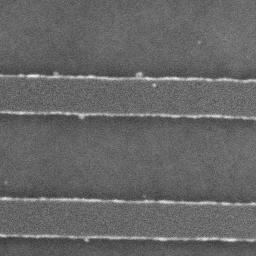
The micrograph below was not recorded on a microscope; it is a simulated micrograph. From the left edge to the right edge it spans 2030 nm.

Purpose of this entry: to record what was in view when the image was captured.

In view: lines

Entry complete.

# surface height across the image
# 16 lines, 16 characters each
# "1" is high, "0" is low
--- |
0000000000000000
0000000000000000
0000000000000000
0000000000000000
0000000000000000
1111111111111111
1111111111111111
0000000000000000
0000000000000000
0000000000000000
0000000000000000
0000000000000000
1111110000000000
1111111111111111
1111111111111111
0000000000000000